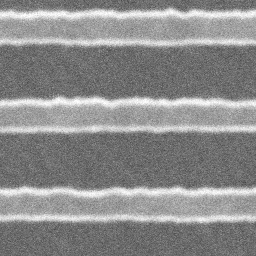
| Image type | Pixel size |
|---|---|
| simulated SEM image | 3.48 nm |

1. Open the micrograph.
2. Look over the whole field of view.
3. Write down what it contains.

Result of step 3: lines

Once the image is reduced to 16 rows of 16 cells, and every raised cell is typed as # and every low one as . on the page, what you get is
................
################
################
................
................
................
################
################
................
................
................
................
################
################
................
................